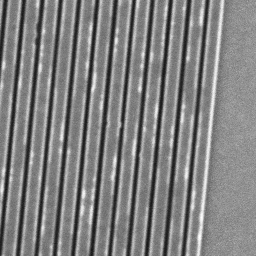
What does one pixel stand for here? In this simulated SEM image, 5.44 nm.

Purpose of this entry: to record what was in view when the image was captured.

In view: parallel lines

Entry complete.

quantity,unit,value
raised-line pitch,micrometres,0.0994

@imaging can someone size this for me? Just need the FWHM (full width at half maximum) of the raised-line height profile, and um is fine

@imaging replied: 0.071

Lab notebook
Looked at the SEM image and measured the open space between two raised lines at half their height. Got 30.4 nm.